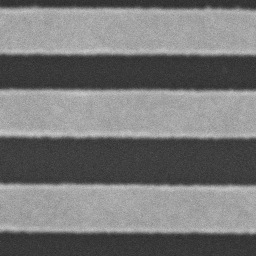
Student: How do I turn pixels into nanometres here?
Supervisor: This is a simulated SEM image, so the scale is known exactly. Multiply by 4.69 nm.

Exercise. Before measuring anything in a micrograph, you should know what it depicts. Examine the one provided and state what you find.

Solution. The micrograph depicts lines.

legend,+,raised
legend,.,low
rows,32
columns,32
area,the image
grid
................................
++++++++++++++++++++++++++++++++
++++++++++++++++++++++++++++++++
++++++++++++++++++++++++++++++++
++++++++++++++++++++++++++++++++
++++++++++++++++++++++++++++++++
++++++++++++++++++++++++++++++++
................................
................................
................................
................................
++++++++++++++++++++++++++++++++
++++++++++++++++++++++++++++++++
++++++++++++++++++++++++++++++++
++++++++++++++++++++++++++++++++
++++++++++++++++++++++++++++++++
++++++++++++++++++++++++++++++++
................................
................................
................................
................................
................................
................................
++++++++++++++++++++++++++++++++
++++++++++++++++++++++++++++++++
++++++++++++++++++++++++++++++++
++++++++++++++++++++++++++++++++
++++++++++++++++++++++++++++++++
++++++++++++++++++++++++++++++++
................................
................................
................................